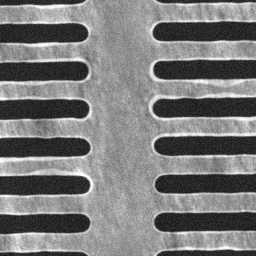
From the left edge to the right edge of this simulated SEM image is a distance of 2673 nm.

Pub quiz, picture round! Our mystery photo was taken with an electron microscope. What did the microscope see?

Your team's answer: groups of lines, slits or small figures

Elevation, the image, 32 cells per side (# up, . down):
..........#############.########
################################
################################
...........########.............
...........########.............
###...##########################
################################
#######...##########............
...........########.............
...........########.............
################################
################################
..........#########.............
...........########.............
...........########.............
################################
################################
...........########.............
...........########.............
..........###########........###
################################
######.#########################
...........########.............
...........########.............
################################
################################
#####################.#.........
...........########.............
...........#########............
################################
################################
..........##########............